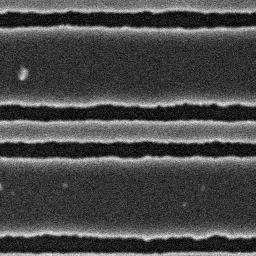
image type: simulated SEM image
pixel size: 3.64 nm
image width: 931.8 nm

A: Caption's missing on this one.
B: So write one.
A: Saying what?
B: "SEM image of lines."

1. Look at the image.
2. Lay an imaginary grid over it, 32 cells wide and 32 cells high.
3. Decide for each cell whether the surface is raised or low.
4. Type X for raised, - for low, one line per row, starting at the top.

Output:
XXXXXXXXXXXXXXXXXXXXXXXXXXXXXXXX
X---XXX----X----X--X-----X-XX--X
--------------------------------
----X-XXXXXXX--X---------------X
XXXXXXXXXXXXXXXXXXXXXXXXXXXXXXXX
XXXXXXXXXXXXXXXXXXXXXXXXXXXXXXXX
XXXXXXXXXXXXXXXXXXXXXXXXXXXXXXXX
XXXXXXXXXXXXXXXXXXXXXXXXXXXXXXXX
XXXXXXXXXXXXXXXXXXXXXXXXXXXXXXXX
XXXXXXXXXXXXXXXXXXXXXXXXXXXXXXXX
XXXXXXXXXXXXXXXXXXXXXXXXXXXXXXXX
XXXXXXXXXXXXXXXXXXXXXXXXXXXXXXXX
XXXXXXXXXXXXXXXXXXXXXXXXXXXXXXXX
--------------------------------
--------------------------------
XXXXXXXXXXXXXXXXXXXXXXXXXXXXXXXX
XXXXXXXXXXXXXXXXXXXXXXXXXXXXXXXX
XXXXXXXXXXXXXXXXXXXXXXXXXXXXXXXX
--------------------------------
--------------------------------
XXXXXXXXXXXXXXXXXXXXXXXXXXXXXXXX
XXXXXXXXXXXXXXXXXXXXXXXXXXXXXXXX
XXXXXXXXXXXXXXXXXXXXXXXXXXXXXXXX
XXXXXXXXXXXXXXXXXXXXXXXXXXXXXXXX
XXXXXXXXXXXXXXXXXXXXXXXXXXXXXXXX
XXXXXXXXXXXXXXXXXXXXXXXXXXXXXXXX
XXXXXXXXXXXXXXXXXXXXXXXXXXXXXXXX
XXXXXXXXXXXXXXXXXXXXXXXXXXXXXXXX
XXXXXXXXXXXXXXXXXXXXXXXXXXXXXXXX
------------XXXXXXXXXXXXXX--XXXX
--------------------------------
--------------------------------